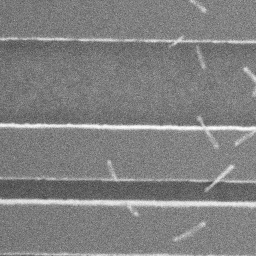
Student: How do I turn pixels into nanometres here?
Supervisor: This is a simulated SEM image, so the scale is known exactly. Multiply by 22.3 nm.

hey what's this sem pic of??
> lines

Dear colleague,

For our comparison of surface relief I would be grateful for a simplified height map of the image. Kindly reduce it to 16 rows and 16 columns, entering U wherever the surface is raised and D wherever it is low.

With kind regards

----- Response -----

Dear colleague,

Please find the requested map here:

UUUUUUUUUUUUUUUU
UUUUUUUUUUUUUUUU
DDDDDUUUUUUUUUUU
DDDDDDDDDDDDDDDD
DDDDDDDDDDDDDDDD
DDDDDDDDDDDDDDDD
DDDDDDDDDDDDDDDD
DDDDDDDDDDDDDDDD
UUUUUUUUUUUUUUUU
UUUUUUUUUUUUUUUU
UUUUUUUUUUUUUUUU
DDDDDDDDDDDDDDDD
DDDDDDDDDDDDDDDD
UUUUUUUUUUUUUUUU
UUUUUUUUUUUUUUUU
UUUUUUUUUUUUUUUU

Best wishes